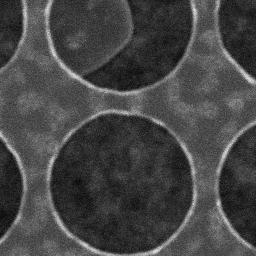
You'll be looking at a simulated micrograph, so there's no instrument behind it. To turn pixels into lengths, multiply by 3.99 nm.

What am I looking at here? holes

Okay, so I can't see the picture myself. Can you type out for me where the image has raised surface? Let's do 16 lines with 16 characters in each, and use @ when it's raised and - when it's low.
-@@---------@@--
-@@---------@@--
-@@---------@@--
-@@@-------@@@--
@@@@@------@@@@-
@@@@@@---@@@@@@@
@@@@@@@@@@@@@@@@
@@@@@@---@@@@@@@
@@@@-------@@@@-
-@@@--------@@--
-@@---------@@--
-@@---------@@--
-@@---------@@--
-@@@--------@@--
@@@@-------@@@@-
@@@@@@----@@@@@@